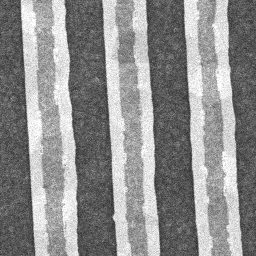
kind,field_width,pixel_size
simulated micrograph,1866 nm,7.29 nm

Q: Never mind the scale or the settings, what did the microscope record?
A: one or a few lines or trenches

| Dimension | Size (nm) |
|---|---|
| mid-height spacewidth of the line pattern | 350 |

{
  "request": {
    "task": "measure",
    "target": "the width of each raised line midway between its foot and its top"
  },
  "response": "240 nanometers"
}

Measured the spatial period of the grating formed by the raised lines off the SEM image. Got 591 nanometers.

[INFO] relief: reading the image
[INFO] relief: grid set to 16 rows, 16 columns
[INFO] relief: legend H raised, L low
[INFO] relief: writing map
LLHHLLLHHLLLHHLL
LLHHLLLHHLLLHHLL
LLHHLLLHHLLLHHLL
LLHHLLLHHLLLHHLL
LLHHLLLHHLLLHHLL
LLHHLLLHHLLLHHLL
LLHHLLLHHLLLHHLL
LLHHLLLHHLLLHHLL
LLHHLLLHHLLLHHLL
LLHHLLLHHLLLHHLL
LLHHLLLHHLLLHHLL
LLHHLLLHHLLLHHHL
LLHHLLLHHLLLLHHL
LLHHLLLHHLLLLHHL
LLHHHLLLHHLLLHHL
LLHHHLLLHHLLLHHL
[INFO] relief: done